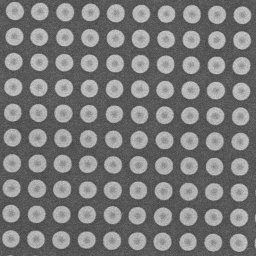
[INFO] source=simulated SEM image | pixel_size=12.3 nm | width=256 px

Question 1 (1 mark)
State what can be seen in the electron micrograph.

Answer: an array of small figures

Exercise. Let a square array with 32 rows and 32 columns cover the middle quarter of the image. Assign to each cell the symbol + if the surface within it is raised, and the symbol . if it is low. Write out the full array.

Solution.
++..++++...++++..++++..++++...++
+....+++...+++...++++...+++...++
................................
................................
++...+++...+++....++....++.....+
++..++++...++++..++++..++++...++
++..++++...++++..++++..++++..+++
++...+++...+++...++++..++++...++
........................++....++
................................
+.....+.........................
++..++++...+++...++++...+++...++
++..++++..+++++..++++..++++..+++
++..++++...+++...++++..++++..+++
.....++.....+.....++....+++...++
................................
................................
++..++++...+++...+++....++....++
++..++++..++++...++++..++++..+++
++..++++...+++...++++..++++..+++
+....++....+++...+++...++++...++
................................
................................
+....+++...++....+++....++.....+
++..++++..++++...++++..++++..+++
++..++++..++++...++++..++++..+++
+...++++...+++...+++...++++..+++
........................++....++
................................
+...............................
++..++++..++++...+++...++++..+++
++..++++..++++...++++..++++..+++